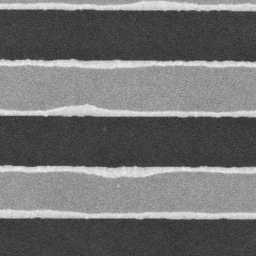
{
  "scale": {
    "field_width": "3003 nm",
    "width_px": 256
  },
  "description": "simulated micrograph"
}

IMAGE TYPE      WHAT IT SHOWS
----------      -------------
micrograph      lines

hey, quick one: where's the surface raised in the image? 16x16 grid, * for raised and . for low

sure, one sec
****************
................
................
................
****************
****************
****************
................
................
................
*****...........
****************
****************
****************
................
................